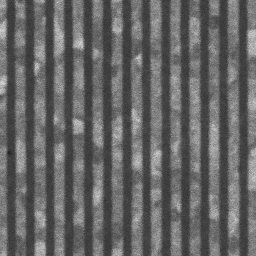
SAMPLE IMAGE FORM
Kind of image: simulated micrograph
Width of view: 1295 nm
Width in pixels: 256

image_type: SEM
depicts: parallel lines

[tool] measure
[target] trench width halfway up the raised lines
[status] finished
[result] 0.0481 µm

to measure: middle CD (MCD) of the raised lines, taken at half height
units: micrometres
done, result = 0.0481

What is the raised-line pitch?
98 nm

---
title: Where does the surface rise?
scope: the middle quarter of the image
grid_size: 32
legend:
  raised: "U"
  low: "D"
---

DDUUUDDUUUDDUUDDDUUDDDUUDDDUUDDU
DDUUUDDUUUDDUUDDDUUDDDUUDDDUUDDD
DDUUUDDUUUDDUUDDDUUDUDUUDDDUUDDD
DDUUUDDUUUDDUUDDDUUDUDUUDDDUUDDD
DDUUUDDUUUDDUUDDDUUDUDUUDDDUUDDD
DDUUUDDUUUDDUUDDDUUDUDUUDDDUUDDD
DDUUUDDUUUDDUUDDDUUDDDUUDDDUUDDD
DDUUUDDUUUDDUUDDDUUDDDUUDDDUUDDD
DDUUUDDUUUDDUUDDDUUDDDUUDDDUUDDD
DDUUUDDUUUDDUUDDDUUDDDUUDDDUUDDD
DDUUUDDUUUDDUUDDDUUDDDUUDDDUUDDD
DDUUUDDUUUDDUUDDDUUDDDUUDDDUUDDD
DDUUUDDUUUDDUUDDDUUDDDUUDDDUUDDD
DDUUUDDUUUDDUUDDDUUDDDUUDDDUUDDD
DDUUUDDUUUDDUUDDDUUDDDUUDDDUUDDD
DDDUUDDUUUDDUUDDDUUDDDUUDDDUUDDD
DDDUUDDUUUDDUUUDDUUDDDUUDDDUUDDD
DDDUUDDUUUDDUUUDDUUDDDUUDDDUUDDD
DDUUUDDUUUDDUUUDDUUDDDUUDDDUUDDD
DDUUUDDUUUDDUUDDDUUDDDUUDDDUUDDD
DDDUUDDUUUDDUUDDDUUDDDUUDDDUUDDD
DDDUUDDUUUDDUUDDDUUDDDUUDDDUUDDD
DDUUUDDUUUDDUUDDDUUDDDUUDDDUUDDD
DDUUUDDUUUDDUUDDDUUDDDUUDDDUUDDD
DDDUUDDUUUDDUUDDDUUDDDUUDDDUUDDD
DDDUUDDUUUDDUUDDDUUDDDUUDDDUUDDD
DDDUUDDUUUDDUUUDDUUDDDUUDDDUUDDD
DDDUUDDUUUDDUUDDDUUDDDUUDDDUUDDD
DDDUUDDUUUDDUUUDDUUDDDUUDDDUUDDD
DDDUUDDUUUDDUUUDDUUDDDUUDDDUUDDD
DDDUUDDUUUDDUUUDDUUDDDUUDDDUUDDD
DDDUUDDUUUDDUUUDDUUDDDUUDDDUUDDD